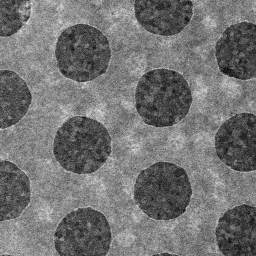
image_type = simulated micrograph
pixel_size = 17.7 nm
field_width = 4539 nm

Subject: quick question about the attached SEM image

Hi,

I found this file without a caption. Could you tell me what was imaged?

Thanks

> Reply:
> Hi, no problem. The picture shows raised bodies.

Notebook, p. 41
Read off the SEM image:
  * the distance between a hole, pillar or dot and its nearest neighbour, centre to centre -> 1630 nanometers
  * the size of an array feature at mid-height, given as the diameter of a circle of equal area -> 1050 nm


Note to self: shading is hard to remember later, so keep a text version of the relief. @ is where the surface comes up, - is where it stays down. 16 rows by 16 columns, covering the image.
@-------@@@@----
@--------@@@---@
----@@@-------@@
---@@@@------@@@
@---@@@--@@---@@
@@-------@@@----
@@------@@@@----
@---@@---@@---@@
---@@@@------@@@
---@@@@------@@@
@---@@---@@---@@
@@------@@@@----
@@------@@@@----
@---@@---@@---@@
---@@@@------@@@
---@@@@-------@@